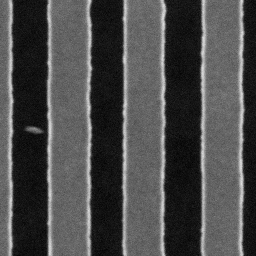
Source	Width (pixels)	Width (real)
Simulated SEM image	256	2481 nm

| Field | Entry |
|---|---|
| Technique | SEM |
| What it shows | lines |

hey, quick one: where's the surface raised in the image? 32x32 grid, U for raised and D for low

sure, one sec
UDDDDDUUUUUDDDDDUUUUDDDDDUUUUUDD
UDDDDDUUUUUDDDDDUUUUUDDDDUUUUUDD
UDDDDDUUUUUDDDDUUUUUUDDDDUUUUUDD
UDDDDDUUUUUDDDDDUUUUUDDDDUUUUUDD
UDDDDDUUUUUDDDDDUUUUUDDDDUUUUUDD
UDDDDDUUUUUDDDDDUUUUUDDDDUUUUUDD
UDDDDDUUUUUDDDDDUUUUDDDDDUUUUUDD
UDDDDDUUUUUDDDDUUUUUDDDDDUUUUUDD
UDDDDDUUUUUDDDDDUUUUDDDDDUUUUUDD
UDDDDDUUUUUDDDDDUUUUUDDDDUUUUUDD
UDDDDDUUUUUDDDDDUUUUUDDDDUUUUUDD
UDDDDDUUUUUDDDDDUUUUUDDDDUUUUUDD
UUDDDDUUUUUDDDDDUUUUUDDDDUUUUUDD
UDDDDDUUUUUDDDDUUUUUUDDDDUUUUUDD
UDDDDDUUUUUDDDDUUUUUUDDDDUUUUUDD
UDDDDDUUUUUDDDDUUUUUUDDDDUUUUUDD
UUDDDDUUUUUDDDDUUUUUDDDDDUUUUUDD
UDDDDDUUUUUDDDDUUUUUUDDDDUUUUUDD
UDDDDDUUUUUDDDDUUUUUDDDDDUUUUUDD
UDDDDDUUUUUDDDDUUUUUUDDDDUUUUUDD
UDDDDDUUUUUDDDDUUUUUUDDDDUUUUUDD
UDDDDDUUUUUDDDDUUUUUDDDDDUUUUUDD
UDDDDDUUUUUDDDDUUUUUDDDDDUUUUUDD
UDDDDDUUUUUDDDDUUUUUDDDDDUUUUUDD
UDDDDDUUUUUDDDDUUUUUDDDDDUUUUUDD
UDDDDDUUUUUDDDDUUUUUDDDDDUUUUUDD
UDDDDDUUUUUDDDDUUUUUDDDDDUUUUUDD
UDDDDDUUUUUDDDDUUUUUDDDDDUUUUUDD
UDDDDDUUUUUDDDDUUUUUDDDDDUUUUUDD
UDDDDDUUUUUDDDDUUUUUDDDDDUUUUUDD
UDDDDDUUUUUDDDDUUUUUDDDDDUUUUUDD
UDDDDDUUUUUDDDDUUUUUUDDDDUUUUUDD